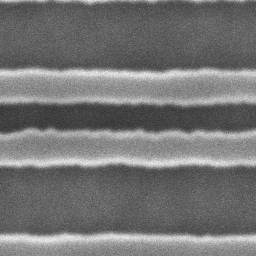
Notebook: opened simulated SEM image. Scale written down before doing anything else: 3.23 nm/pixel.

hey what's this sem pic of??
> lines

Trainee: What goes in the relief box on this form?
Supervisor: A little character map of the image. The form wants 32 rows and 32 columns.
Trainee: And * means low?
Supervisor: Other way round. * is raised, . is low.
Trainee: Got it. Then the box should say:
................................
................................
................................
................................
................................
................................
................................
................................
................................
********************************
********************************
********************************
********************************
................................
................................
................................
...********.**..**...**.*......*
********************************
********************************
********************************
*******...***....*****....****.*
................................
................................
................................
................................
................................
................................
................................
................................
........*...****.*..............
********************************
********************************